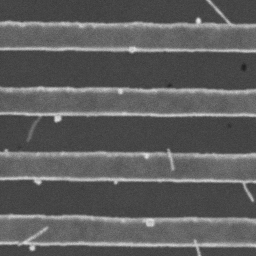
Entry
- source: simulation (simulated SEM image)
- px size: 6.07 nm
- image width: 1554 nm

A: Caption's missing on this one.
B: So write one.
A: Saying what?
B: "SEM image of lines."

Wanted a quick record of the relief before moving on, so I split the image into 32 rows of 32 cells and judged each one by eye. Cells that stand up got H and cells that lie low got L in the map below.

LLLLLLLLLLLLLLLLLLLLLLLLLLLLLLLL
LLLLLLLLLLLLLLLLLLLLLLLLLLLLLLLL
LLLLLLLLLLLLLLLLLLLLLLLLLLLLLLLL
HHHHHHHHHHHHHHHHHHHHHHHHHHHHHHHH
HHHHHHHHHHHHHHHHHHHHHHHHHHHHHHHH
HHHHHHHHHHHHHHHHHHHHHHHHHHHHHHHH
LLLLLLLLLLLLLLLLLLLLLLLLLLLLLLLL
LLLLLLLLLLLLLLLLLLLLLLLLLLLLLLLL
LLLLLLLLLLLLLLLLLLLLLLLLLLLLLLLL
LLLLLLLLLLLLLLLLLLLLLLLLLLLLLLLL
LLLLLLLLLLLLLLLLLLLLLLLLLLLLLLLL
HHHHHHHHHHHHHHHHHHHHHHHHHHHHHHHH
HHHHHHHHHHHHHHHHHHHHHHHHHHHHHHHH
HHHHHHHHHHHHHHHHHHHHHHHHHHHHHHHH
LLLLLLLHLLLLLLLLLLLLHLLLLLLLLLLH
LLLLLLLLLLLLLLLLLLLLLLLLLLLLLLLL
LLLLLLLLLLLLLLLLLLLLLLLLLLLLLLLL
LLLLLLLLLLLLLLLLLLLLLLLLLLLLLLLL
LLLLLLLLLLLLLLLLLLLLLLLLLLLLLLLL
HHHHHHHHHHHHHHHHHHHHHHHHHHHHHHHH
HHHHHHHHHHHHHHHHHHHHHHHHHHHHHHHH
HHHHHHHHHHHHHHHHHHHHHHHHHHHHHHHH
LLLLHLLLLLLLLLLLLHHHHHHHHHHHHHHH
LLLLLLLLLLLLLLLLLLLLLLLLLLLLLLLL
LLLLLLLLLLLLLLLLLLLLLLLLLLLLLLLL
LLLLLLLLLLLLLLLLLLLLLLLLLLLLLLLL
LLLLLLLLLLLLLLLLLLLLLLLLLLLLLLLL
HHHHHHHHHHHHHHHHHHHHHHHHHHHHHHHL
HHHHHHHHHHHHHHHHHHHHHHHHHHHHHHHH
HHHHHHHHHHHHHHHHHHHHHHHHHHHHHHHH
LLHHHHHHHLHHHHHHHHHHHHHHHHHHHHHH
LLLLLLLLLLLLLLLLLLLLLLLLLLLLLLLL